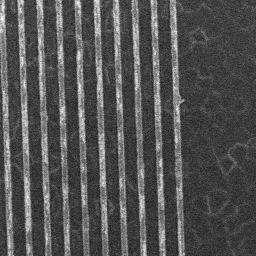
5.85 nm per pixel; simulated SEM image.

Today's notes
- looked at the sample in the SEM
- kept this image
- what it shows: parallel lines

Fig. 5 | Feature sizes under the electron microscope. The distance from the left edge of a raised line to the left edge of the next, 111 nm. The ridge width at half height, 29.2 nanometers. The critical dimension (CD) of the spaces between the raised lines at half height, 13.4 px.